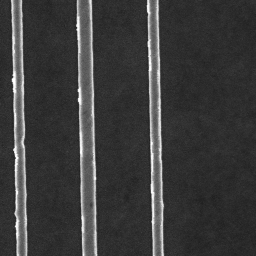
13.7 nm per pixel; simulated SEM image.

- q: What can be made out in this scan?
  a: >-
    one or a few lines or trenches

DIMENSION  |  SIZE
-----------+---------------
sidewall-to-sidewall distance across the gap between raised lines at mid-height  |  770 nm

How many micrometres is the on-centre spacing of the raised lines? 0.933